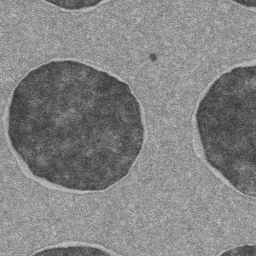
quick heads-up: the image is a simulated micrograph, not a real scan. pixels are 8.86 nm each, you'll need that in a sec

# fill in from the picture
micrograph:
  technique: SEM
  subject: holes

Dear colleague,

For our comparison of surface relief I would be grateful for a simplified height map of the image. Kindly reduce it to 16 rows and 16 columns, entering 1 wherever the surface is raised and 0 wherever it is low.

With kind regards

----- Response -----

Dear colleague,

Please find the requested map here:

1111011111111111
1111111111111111
1111111111111111
1111111111111111
1100001111111100
1000000011111000
1000000001110000
0000000001110000
0000000001110000
1000000001110000
1100000011111000
1110000111111100
1111111111111111
1111111111111111
1111111111111111
1111001111111110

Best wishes